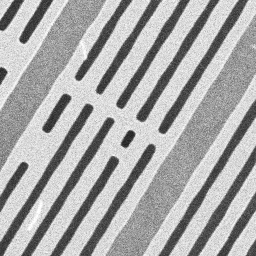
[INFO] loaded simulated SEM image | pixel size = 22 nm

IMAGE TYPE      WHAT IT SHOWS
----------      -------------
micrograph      groups of lines, slits or small figures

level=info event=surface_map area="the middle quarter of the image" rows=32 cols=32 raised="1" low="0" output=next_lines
01110001111100111110001111000111
11110011111000111100011110001111
11100011110001111100011110001111
11100111110011111000111100011111
11111111100011110001111000011110
11111111000111110001111000111100
11111111001111100011110001111100
01111111001111000111110001111000
00111111111111000111100011110001
00111111111110001111000111110001
01111001111110001111000111100011
11111001111111111110001111000011
11110001111111111100001111000111
11100011111011111100011110001111
11100011110001111110111110001110
11000111110011111111111100011110
10000111100011111111111100111100
10001111000111110011111101111000
00011111001111100011111111111000
00111110001111000111111111110000
00111100011111001111100111100000
01111100011111111111000111100000
01111000111111111111000111000000
11110000111101111110001110000000
11110001111000111100001110000000
11100011110001111100011100000000
11100111110001111000111000000000
11000111100011111000111000000000
10001111100011110001110000000000
10001111000111100011110000000001
00011110001111100011100000000001
00111110001111000111100000000011